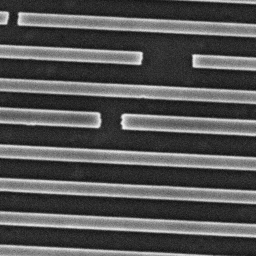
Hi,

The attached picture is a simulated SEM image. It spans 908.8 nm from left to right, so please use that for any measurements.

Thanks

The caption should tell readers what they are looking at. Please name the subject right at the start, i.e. parallel lines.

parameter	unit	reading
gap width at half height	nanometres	75.8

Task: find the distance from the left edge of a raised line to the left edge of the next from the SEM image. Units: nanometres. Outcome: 118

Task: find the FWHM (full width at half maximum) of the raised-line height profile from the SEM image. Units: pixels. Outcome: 12.1